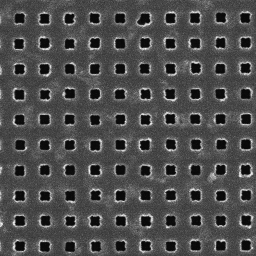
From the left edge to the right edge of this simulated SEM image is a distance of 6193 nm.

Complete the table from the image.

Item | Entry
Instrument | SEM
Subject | a regular array of holes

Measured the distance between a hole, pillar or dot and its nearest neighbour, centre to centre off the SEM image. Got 0.6 µm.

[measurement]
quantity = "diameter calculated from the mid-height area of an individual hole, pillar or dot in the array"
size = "0.262 micrometres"